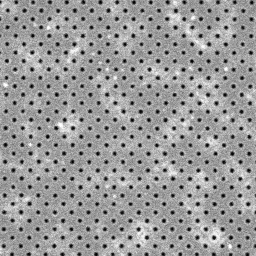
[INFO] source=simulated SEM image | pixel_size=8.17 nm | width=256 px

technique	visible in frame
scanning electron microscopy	a regular array of holes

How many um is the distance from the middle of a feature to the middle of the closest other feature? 0.0953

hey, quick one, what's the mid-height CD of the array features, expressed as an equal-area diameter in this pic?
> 0.038 micrometres